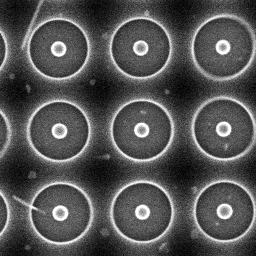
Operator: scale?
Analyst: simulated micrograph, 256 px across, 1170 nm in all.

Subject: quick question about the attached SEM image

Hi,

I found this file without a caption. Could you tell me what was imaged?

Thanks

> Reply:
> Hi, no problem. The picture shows an array of small figures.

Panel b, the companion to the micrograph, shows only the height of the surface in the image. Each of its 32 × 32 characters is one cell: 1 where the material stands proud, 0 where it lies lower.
11111111111111111111111111111111
11111111111111111111111111111111
11111100111111110001111111000011
11111000001111100000111110000001
11110000000111000000011100000000
01110001000111000100011100000000
01110001000111000100011100000000
01110000000111000000011100000001
11111000001111100000111110000001
11111100011111111001111111000111
11111111111111111111111111111111
11111111111111111111111111111111
11111111111111111111111111100111
11111000001111100000111110000001
11110000000111000000011110000001
01110000000111000000011100000000
01110001000111000100011100011000
01110000000111000000011100000000
01110000001111100000011110000001
11111000011111110000111111000011
11111111111111111111111111111111
11111111111111111111111111111111
11111111111111111111111111111111
11111100001111110000111111000011
11111000000111100000011110000001
01110000000111000000011110000000
01110001000111000100001100011000
01110000000111000000011110000000
01110000000111100000011110000001
11111000001111110000111111000011
11111111111111111111111111111111
11111111111111111111111111111111